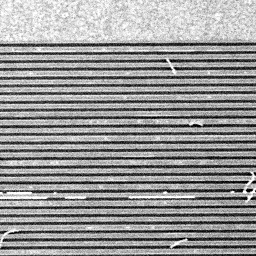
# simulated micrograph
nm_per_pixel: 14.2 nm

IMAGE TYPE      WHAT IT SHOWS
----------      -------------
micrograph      parallel lines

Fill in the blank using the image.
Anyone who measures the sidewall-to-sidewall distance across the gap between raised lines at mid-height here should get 55.1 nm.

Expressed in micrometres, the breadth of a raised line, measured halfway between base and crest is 0.0551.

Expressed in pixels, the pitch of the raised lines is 8.11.